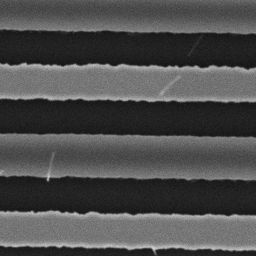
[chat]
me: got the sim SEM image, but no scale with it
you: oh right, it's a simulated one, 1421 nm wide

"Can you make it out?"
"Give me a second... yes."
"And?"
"lines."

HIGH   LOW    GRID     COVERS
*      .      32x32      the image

********************************
********************************
********************************
********************************
................................
................................
................................
................................
*************************.****..
********************************
********************************
********************************
..............**.***************
................................
................................
................................
................................
********************************
********************************
********************************
********************************
********************************
................................
................................
................................
................................
......*.........................
********************************
********************************
********************************
********************************
................................